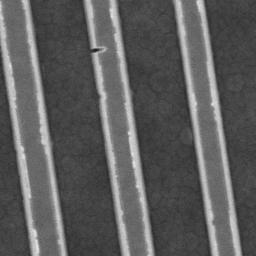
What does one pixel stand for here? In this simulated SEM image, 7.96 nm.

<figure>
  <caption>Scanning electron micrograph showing one or a few lines or trenches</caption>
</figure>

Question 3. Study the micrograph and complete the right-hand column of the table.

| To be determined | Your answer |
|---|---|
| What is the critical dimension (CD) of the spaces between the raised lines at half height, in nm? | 496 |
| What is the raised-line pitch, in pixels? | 87.8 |